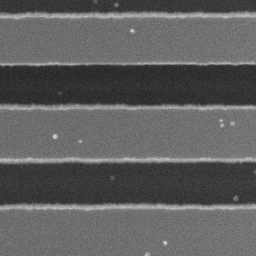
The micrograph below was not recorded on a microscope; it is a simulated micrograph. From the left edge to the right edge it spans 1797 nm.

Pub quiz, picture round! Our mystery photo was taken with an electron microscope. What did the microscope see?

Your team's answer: lines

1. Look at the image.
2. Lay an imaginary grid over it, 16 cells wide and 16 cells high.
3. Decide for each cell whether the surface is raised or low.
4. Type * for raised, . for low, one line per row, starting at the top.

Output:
................
****************
****************
****************
................
................
................
****************
****************
****************
................
................
................
****************
****************
****************